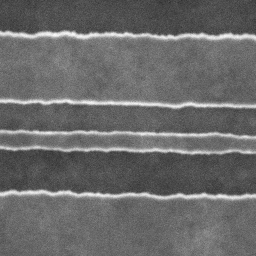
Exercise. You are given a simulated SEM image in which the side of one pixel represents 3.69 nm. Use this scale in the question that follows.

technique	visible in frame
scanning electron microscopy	lines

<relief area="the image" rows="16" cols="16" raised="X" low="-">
----------------
----------------
XXXXXXXXXXXXXXXX
XXXXXXXXXXXXXXXX
XXXXXXXXXXXXXXXX
XXXXXXXXXXXXXXXX
XXXXXXXXXXXXXXXX
XXXXXXXXXXXXXXXX
XXXXXXXXXXXXXXXX
-----------XXX-X
----------------
----------------
XXXXXXXXXXXXXXXX
XXXXXXXXXXXXXXXX
XXXXXXXXXXXXXXXX
XXXXXXXXXXXXXXXX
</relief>